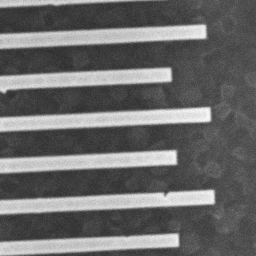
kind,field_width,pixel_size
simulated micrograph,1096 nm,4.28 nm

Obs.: parallel lines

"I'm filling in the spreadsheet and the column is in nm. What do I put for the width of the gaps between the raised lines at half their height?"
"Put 121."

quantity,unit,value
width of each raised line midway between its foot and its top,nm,58.2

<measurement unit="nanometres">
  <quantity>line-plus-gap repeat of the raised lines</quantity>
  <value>177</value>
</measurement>